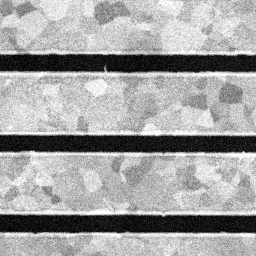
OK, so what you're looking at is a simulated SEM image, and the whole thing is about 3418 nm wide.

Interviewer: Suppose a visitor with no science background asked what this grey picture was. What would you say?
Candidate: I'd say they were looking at one or a few lines or trenches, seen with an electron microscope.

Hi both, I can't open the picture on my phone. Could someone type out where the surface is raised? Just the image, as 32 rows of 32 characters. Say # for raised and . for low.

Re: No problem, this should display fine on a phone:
################################
################################
################################
################################
################################
################################
#.......########################
................................
................................
################################
################################
################################
################################
################################
################################
################################
################################
................................
................................
################################
################################
################################
################################
################################
################################
################################
....############################
................................
................................
################################
################################
################################